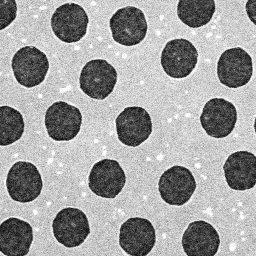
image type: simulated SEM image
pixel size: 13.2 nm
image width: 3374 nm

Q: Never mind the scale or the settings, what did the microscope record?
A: a regular array of holes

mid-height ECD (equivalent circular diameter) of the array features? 516 nm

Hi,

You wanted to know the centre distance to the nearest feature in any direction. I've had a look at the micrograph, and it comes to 777 nm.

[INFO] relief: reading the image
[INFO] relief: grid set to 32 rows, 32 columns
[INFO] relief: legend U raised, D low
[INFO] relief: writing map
DDUUUUUUDDUUUUUUUUUUUUDDDDDUUUUD
DDUUUUUDDDDUUUDDDDUUUUDDDDDUUUUD
DDUUUUDDDDDUUUDDDDUUUUUDDDUUUUUD
DUUUUUDDDDDUUUDDDDUUUUUUUUUUUUUU
UUUUUUUDDDDUUUDDDDUUUUUUUUUUUUUU
UUUUUUUUUUUUUUUDDUUUUDDDUUUUUUUU
UUDDDUUUUUUUUUUUUUUUDDDDDUUUDDDU
UDDDDDUUUUUDDUUUUUUUDDDDDUUDDDDD
UDDDDDUUUUDDDDUUUUUUDDDDUUUDDDDD
UUDDDDUUUUDDDDDUUUUUUDDUUUUDDDDU
UUDDDUUUUUDDDDDUUUUUUUUUUUUUDDDU
UUUUUUUUUUDDDDUUUUUUUUUUUUUUUUUU
UUUUUUUUUUUUDUUUUUUUUUUUUUDDUUUU
DDUUUUDDDDUUUUUUDDUUUUUUUDDDDUUU
DDDUUUDDDDUUUUUDDDDUUUUUUDDDDDUU
DDDUUUDDDDUUUUDDDDDUUUUUUDDDDUUU
DDDUUUDDDDUUUUUDDDDUUUUUUUDDDUUU
DDUUUUUDDUUUUUUDDDUUUUUUUUUUUUUU
UUUUUUUUUUUUUUUUUUUUUUUUUUUUUUUU
UUUUUUUUUUUUUUUUUUUUUUUUUUUUUDDD
UUDDUUUUUUUUDDDUUUUUUUUUUUUUDDDD
UDDDDUUUUUUDDDDUUUUUDDDDUUUUDDDD
UDDDDUUUUUUDDDDDUUUUDDDDUUUUDDDD
UDDDDUUUUUUDDDDUUUUUDDDDDUUUUDDU
UDDDDUUUUUUUDDDUUUUUDDDDUUUUUUUU
UUUUUUUUUUUUUUUUUUUUUDDUUUUUUUUU
UUUUUUUDDDUUUUUUUUUUUUUUUUUUUUUU
UDDUUUUDDDDUUUUUDDUUUUUUUUUUUUUU
DDDDUUUDDDDUUUUDDDDUUUUDDDDUUUUU
DDDDUUUDDDDUUUUDDDDUUUUDDDDUUUUU
DDDDUUUUDDUUUUUDDDDUUUUDDDDUUUUU
DDDDUUUUUUUUUUUUDDDUUUUDDDDUUUUU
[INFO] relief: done